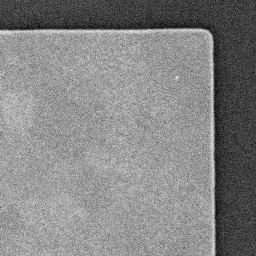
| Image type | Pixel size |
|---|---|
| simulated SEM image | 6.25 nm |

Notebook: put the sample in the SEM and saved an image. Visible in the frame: wiring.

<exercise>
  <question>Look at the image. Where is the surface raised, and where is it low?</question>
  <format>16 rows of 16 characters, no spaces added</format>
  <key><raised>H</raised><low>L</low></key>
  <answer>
LLLLLLLLLLLLLLLL
LLLLLLLLLLLLLLLL
HHHHHHHHHHHHHLLL
HHHHHHHHHHHHHLLL
HHHHHHHHHHHHHLLL
HHHHHHHHHHHHHLLL
HHHHHHHHHHHHHLLL
HHHHHHHHHHHHHLLL
HHHHHHHHHHHHHLLL
HHHHHHHHHHHHHLLL
HHHHHHHHHHHHHLLL
HHHHHHHHHHHHHLLL
HHHHHHHHHHHHHLLL
HHHHHHHHHHHHHLLL
HHHHHHHHHHHHHLLL
HHHHHHHHHHHHHLLL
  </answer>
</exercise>